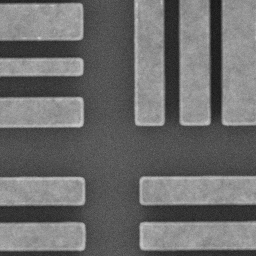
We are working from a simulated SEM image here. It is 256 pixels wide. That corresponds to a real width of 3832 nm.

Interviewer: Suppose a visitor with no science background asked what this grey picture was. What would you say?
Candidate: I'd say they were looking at groups of lines, slits or small figures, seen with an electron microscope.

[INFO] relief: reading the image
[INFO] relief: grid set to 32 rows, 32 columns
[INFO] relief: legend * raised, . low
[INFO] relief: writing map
.................***...***..****
**********.......***...***..****
**********.......***...***..****
**********.......***...***..****
**********.......***...***..****
.................***...***..****
.................***...***..****
**********.......***...***..****
**********.......***...***..****
.................***...***..****
.................***...***..****
.................***...***..****
**********.......***...***..****
**********.......***...***..****
**********.......***...***..****
**********........**............
................................
................................
................................
................................
................................
................................
**********........**************
**********........**************
**********........**************
**********........**............
................................
................................
**********........**************
**********........**************
**********........**************
................................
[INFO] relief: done